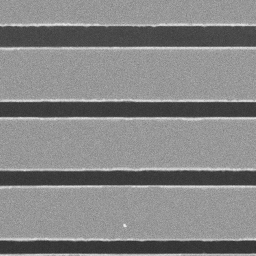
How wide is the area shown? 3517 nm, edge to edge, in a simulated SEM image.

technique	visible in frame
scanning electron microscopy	lines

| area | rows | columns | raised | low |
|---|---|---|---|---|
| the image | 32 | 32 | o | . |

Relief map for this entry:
oooooooooooooooooooooooooooooooo
oooooooooooooooooooooooooooooooo
oooooooooooooooooooooooooooooooo
................................
................................
................................
oooooooooooooooooooooooooooooooo
oooooooooooooooooooooooooooooooo
oooooooooooooooooooooooooooooooo
oooooooooooooooooooooooooooooooo
oooooooooooooooooooooooooooooooo
oooooooooooooooooooooooooooooooo
oooooooooooooooooooooooooooooooo
................................
................................
oooooooooooooooooooooooooooooooo
oooooooooooooooooooooooooooooooo
oooooooooooooooooooooooooooooooo
oooooooooooooooooooooooooooooooo
oooooooooooooooooooooooooooooooo
oooooooooooooooooooooooooooooooo
................................
................................
oooooooooooooooooooooooooooooooo
oooooooooooooooooooooooooooooooo
oooooooooooooooooooooooooooooooo
oooooooooooooooooooooooooooooooo
oooooooooooooooooooooooooooooooo
oooooooooooooooooooooooooooooooo
oooooooooooooooooooooooooooooooo
................................
................................